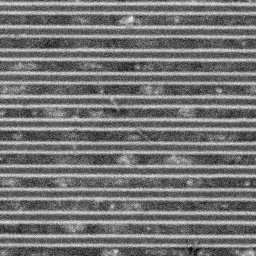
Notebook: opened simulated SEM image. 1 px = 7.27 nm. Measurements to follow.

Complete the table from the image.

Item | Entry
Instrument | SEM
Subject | parallel lines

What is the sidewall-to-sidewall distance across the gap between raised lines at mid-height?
101 nm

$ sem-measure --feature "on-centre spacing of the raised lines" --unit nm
169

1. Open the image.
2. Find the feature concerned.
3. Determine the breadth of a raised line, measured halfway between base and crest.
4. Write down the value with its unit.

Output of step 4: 71.8 nanometers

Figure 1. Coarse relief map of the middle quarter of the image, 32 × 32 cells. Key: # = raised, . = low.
................................
................................
################################
################################
################################
................................
................................
................................
################################
################################
..........#############.........
................................
................................
................................
################################
################################
..................##............
................................
................................
................................
################################
################################
................................
................................
................................
................................
################################
################################
................................
................................
................................
################################